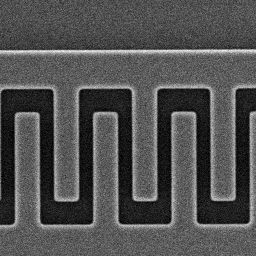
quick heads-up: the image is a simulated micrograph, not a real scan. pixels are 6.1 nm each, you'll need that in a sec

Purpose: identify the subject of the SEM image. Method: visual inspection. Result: groups of lines, slits or small figures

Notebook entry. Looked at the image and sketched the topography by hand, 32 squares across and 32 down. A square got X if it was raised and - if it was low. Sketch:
--------------------------------
--------------------------------
--------------------------------
--------------------------------
--------------------------------
--------------------------------
XXXXXXXXXXXXXXXXXXXXXXXXXXXXXXXX
XXXXXXXXXXXXXXXXXXXXXXXXXXXXXXXX
XXXXXXXXXXXXXXXXXXXXXXXXXXXXXXXX
XXXXXXXXXXXXXXXXXXXXXXXXXXXXXXXX
XXXXXXXXXXXXXXXXXXXXXXXXXXXXXXXX
-------XXX------XXXX------XXX---
-------XXX-------XXX------XXX---
-------XXX-------XXX------XXX---
--XXX--XXX--XXX--XXX-XXX--XXX--X
--XXX--XXX--XXX--XXX-XXX--XXX--X
--XXX--XXX--XXX--XXX-XXX--XXX--X
--XXX--XXX--XXX--XXX-XXX--XXX--X
--XXX--XXX--XXX--XXX-XXX--XXX--X
--XXX--XXX--XXX--XXX-XXX--XXX--X
--XXX--XXX--XXX--XXX-XXX--XXX--X
--XXX--XXX--XXX--XXX-XXX--XXX--X
--XXX--XXX--XXX--XXX-XXX--XXX--X
--XXX--XXX--XXX--XXX-XXX--XXX--X
--XXX--XXX--XXX--XXX-XXX--XXX--X
--XXX-------XXX------XXX-------X
--XXX-------XXX------XXX-------X
--XXX-------XXX------XXXX------X
XXXXXXXXXXXXXXXXXXXXXXXXXXXXXXXX
XXXXXXXXXXXXXXXXXXXXXXXXXXXXXXXX
XXXXXXXXXXXXXXXXXXXXXXXXXXXXXXXX
XXXXXXXXXXXXXXXXXXXXXXXXXXXXXXXX